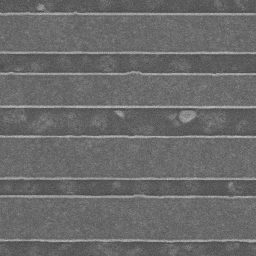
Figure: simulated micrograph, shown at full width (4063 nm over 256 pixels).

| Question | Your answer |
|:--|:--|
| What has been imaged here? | one or a few lines or trenches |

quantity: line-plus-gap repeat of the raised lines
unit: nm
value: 980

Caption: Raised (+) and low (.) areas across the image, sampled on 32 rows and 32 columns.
................................
................................
++++++++++++++++++++++++++++++++
++++++++++++++++++++++++++++++++
++++++++++++++++++++++++++++++++
++++++++++++++++++++++++++++++++
.+++.++++.++++++++++++++++++++++
................................
................................
++++++++++++++++++++++++++++++++
++++++++++++++++++++++++++++++++
++++++++++++++++++++++++++++++++
++++++++++++++++++++++++++++++++
................................
................................
................................
................................
++++++++++++++++++++++++++++++++
++++++++++++++++++++++++++++++++
++++++++++++++++++++++++++++++++
++++++++++++++++++++++++++++++++
++++++++++++++++++++++++++++++++
................................
................................
................++..............
++++++++++++++++++++++++++++++++
++++++++++++++++++++++++++++++++
++++++++++++++++++++++++++++++++
++++++++++++++++++++++++++++++++
++++++++++++++++++++++++++++++++
................................
................................